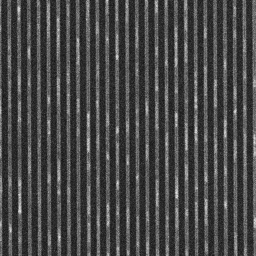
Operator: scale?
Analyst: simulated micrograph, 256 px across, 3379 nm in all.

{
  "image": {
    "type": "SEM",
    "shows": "parallel lines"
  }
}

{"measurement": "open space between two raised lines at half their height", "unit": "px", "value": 7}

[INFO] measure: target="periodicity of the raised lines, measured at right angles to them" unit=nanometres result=129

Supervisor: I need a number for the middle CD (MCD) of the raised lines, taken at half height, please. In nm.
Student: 31.3